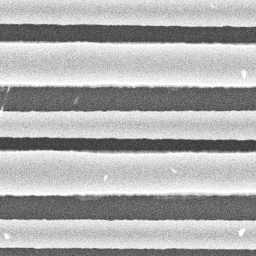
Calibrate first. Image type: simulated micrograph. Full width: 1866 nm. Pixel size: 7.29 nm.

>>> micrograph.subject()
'lines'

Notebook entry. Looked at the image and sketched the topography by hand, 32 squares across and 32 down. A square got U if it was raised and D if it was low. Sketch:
UUUUUUUUUUUUUUUUUUUUUUUUUUUUUUUU
UUUUUUUUUUUUUUUUUUUUUUUUUUUUUUUU
UUUUUUUUUUUUUUUUUUUUUUUUUUUUUUUU
DDDDDDDDDDDDDDDDDDDDDDDDDDDDDDDD
DDDDDDDDDDDDDDDDDDDDDDDDDDDDDDDD
UUUUUUUUUUUUUUUUUUUUUUUUDUUUDDDD
UUUUUUUUUUUUUUUUUUUUUUUUUUUUUUUU
UUUUUUUUUUUUUUUUUUUUUUUUUUUUUUUU
UUUUUUUUUUUUUUUUUUUUUUUUUUUUUUUU
UUUUUUUUUUUUUUUUUUUUUUUUUUUUUUUU
UUUUUUUUUUUUUUUUUUUUUUUUUUUUUUUU
DDDDDDDDDDDDDDDDDDDDDDDDDDDDDDDD
DDDDDDDDDDDDDDDDDDDDDDDDDDDDDDDD
DDDDDDDDDDDDDDDDDDDDDDDDDDDDDDDD
UUUUUUUUUUUUUUUUUUUUUUUUUUUUUUUU
UUUUUUUUUUUUUUUUUUUUUUUUUUUUUUUU
UUUUUUUUUUUUUUUUUUUUUUUUUUUUUUUU
DDDDDDDDDDDDDDDDDDDDDDDDDDDDDDDD
DDDDDDDDDDDDDDDDDDDDDDDDDDDDDDDD
UUUUUUUUUUUUUUUUUUUUUUUUUUUUUUUU
UUUUUUUUUUUUUUUUUUUUUUUUUUUUUUUU
UUUUUUUUUUUUUUUUUUUUUUUUUUUUUUUU
UUUUUUUUUUUUUUUUUUUUUUUUUUUUUUUU
UUUUUUUUUUUUUUUUUUUUUUUUUUUUUUUU
DDDDDDDDDDDDDDDDDDDDDDDDDDDDDDDD
DDDDDDDDDDDDDDDDDDDDDDDDDDDDDDDD
DDDDDDDDDDDDDDDDDDDDDDDDDDDDDDDD
DDDDDDDDDDDDDDDDDDDDDDDDDDDDDDDD
UUUUUUUUUUUUUUUUUUUUUUUUUUUUUUUU
UUUUUUUUUUUUUUUUUUUUUUUUUUUUUUUU
UUUUUUUUUUUUUUUUUUUUUUUUUUUUUUUU
DDDDDDDDDDDDDDDDDDDDDDDDDDDDDDDD